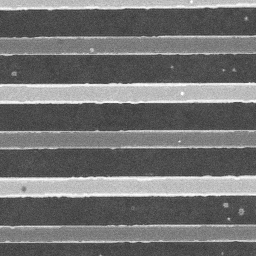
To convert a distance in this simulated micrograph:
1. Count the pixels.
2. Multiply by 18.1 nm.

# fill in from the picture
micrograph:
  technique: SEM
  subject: lines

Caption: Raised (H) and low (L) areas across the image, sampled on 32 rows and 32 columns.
HHHHHHHHHHHHHHHHHHHHHHHHHHHHHHHH
LLLLLLLLLLLLLLLLLLLLLLLLLLLLLLLL
LLLLLLLLLLLLLLLLLLLLLLLLLLLLLLLL
LLLLLLLLLLLLLLLLLLLLLLLLLLLLLLLL
LLLLLLLLLLLLLLLLLLLLLLLLLLLLLLLL
HHHHHHHHHHHHHHHHHHHHHHHHHHHHHHHH
HHHHHHHHHHHHHHHHHHHHHHHHHHHHHHHH
LLLLLLLLLLLLLLLLLLLLLLLLLLLLLLLL
LLLLLLLLLLLLLLLLLLLLLLLLLLLLLLLL
LLLLLLLLLLLLLLLLLLLLLLLLLLLLLLLL
LLLLLLLLLLLLLLLLLLLLLLLHHHHHHHHH
HHHHHHHHHHHHHHHHHHHHHHHHHHHHHHHH
HHHHHHHHHHHHHHHHHHHHHHHHHHHHHHHH
LLLLLLLLLLLLLLLLLLLLLLLLLLLLLLLL
LLLLLLLLLLLLLLLLLLLLLLLLLLLLLLLL
LLLLLLLLLLLLLLLLLLLLLLLLLLLLLLLL
HHHHHHHHHHHHHHHHHHHHHHHHHHHHHHHH
HHHHHHHHHHHHHHHHHHHHHHHHHHHHHHHH
HHHHHHHLLLLLLLHLLLLLLLLLLLLLLLLL
LLLLLLLLLLLLLLLLLLLLLLLLLLLLLLLL
LLLLLLLLLLLLLLLLLLLLLLLLLLLLLLLL
LLLLLLLLLLLLLLLLLLLLLLLLLLLLLLLL
HHHHHHHHHHHHHHHHHHHHHHHHHHHHHHHH
HHHHHHHHHHHHHHHHHHHHHHHHHHHHHHHH
HLLLLLLLLLLLLLLLLLLLLLLLLLLLLLLL
LLLLLLLLLLLLLLLLLLLLLLLLLLLLLLLL
LLLLLLLLLLLLLLLLLLLLLLLLLLLLLLLL
LLLLLLLLLLLLLLLLLLLLLLLLLLLLLLLL
HHHHHHHHHHHHHHHHHHHHHHHHHHHHHHHH
HHHHHHHHHHHHHHHHHHHHHHHHHHHHHHHH
LLLLLLLLLLLLLLLLLLLLLLLLLLLLLLLL
LLLLLLLLLLLLLLLLLLLLLLLLLLLLLLLL